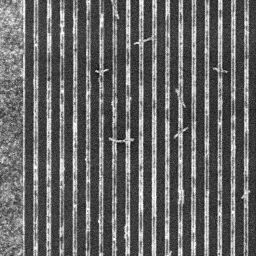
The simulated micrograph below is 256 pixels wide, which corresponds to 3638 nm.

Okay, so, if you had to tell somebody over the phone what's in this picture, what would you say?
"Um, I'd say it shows parallel lines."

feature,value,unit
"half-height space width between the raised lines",137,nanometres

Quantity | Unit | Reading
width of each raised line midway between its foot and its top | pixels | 3.5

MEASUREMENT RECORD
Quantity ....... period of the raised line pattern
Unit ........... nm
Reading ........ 187